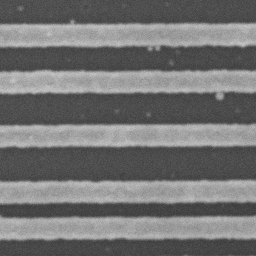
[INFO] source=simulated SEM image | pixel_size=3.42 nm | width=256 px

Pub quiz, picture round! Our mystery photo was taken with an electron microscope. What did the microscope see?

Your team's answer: lines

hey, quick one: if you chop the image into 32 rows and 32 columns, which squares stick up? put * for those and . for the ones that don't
................................
................................
................................
********************************
********************************
*******************************.
................................
................................
................................
********************************
********************************
.*..............................
................................
................................
................................
................................
********************************
********************************
................................
................................
................................
................................
................................
********************************
********************************
................................
................................
***.****************************
********************************
********************************
................................
................................